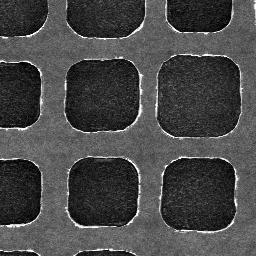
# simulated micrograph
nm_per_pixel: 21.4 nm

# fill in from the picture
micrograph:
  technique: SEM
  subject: holes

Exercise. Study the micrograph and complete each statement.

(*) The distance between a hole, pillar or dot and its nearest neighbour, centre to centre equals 2060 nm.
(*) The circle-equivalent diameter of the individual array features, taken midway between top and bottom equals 79.5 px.